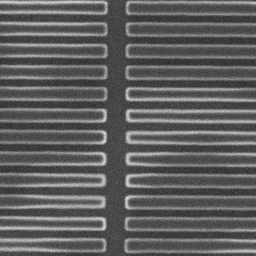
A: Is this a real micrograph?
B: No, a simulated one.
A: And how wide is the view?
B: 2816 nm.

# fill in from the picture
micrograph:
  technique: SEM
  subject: groups of lines, slits or small figures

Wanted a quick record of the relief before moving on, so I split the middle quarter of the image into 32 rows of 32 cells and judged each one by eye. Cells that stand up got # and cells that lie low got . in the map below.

.#########......................
###########.....################
###########.....################
##....####......################
................................
................................
###########.....################
###########.....################
###########.....################
................................
................................
##..####........................
##########......################
##########......################
................................
................................
................................
##########......################
##########......################
##########......################
................................
................................
##########......################
##########......################
##########......################
................................
................................
................................
##########......################
##########......################
...................#############
................................